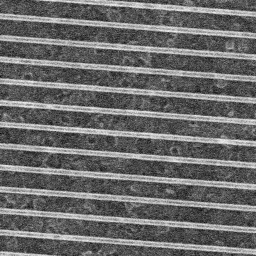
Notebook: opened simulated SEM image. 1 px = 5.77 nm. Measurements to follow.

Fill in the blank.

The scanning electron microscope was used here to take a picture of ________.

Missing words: parallel lines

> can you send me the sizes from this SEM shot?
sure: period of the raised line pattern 124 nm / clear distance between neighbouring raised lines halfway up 98.4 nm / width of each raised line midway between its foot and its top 26.6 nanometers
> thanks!